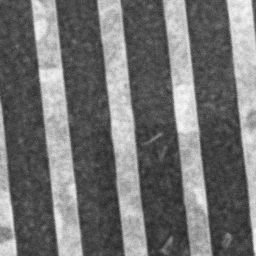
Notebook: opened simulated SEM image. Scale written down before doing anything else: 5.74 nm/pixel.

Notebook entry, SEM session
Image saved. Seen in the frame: one or a few lines or trenches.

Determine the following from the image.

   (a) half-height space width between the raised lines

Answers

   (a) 256 nm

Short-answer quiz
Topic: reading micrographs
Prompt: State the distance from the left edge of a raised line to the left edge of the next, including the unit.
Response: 65 pixels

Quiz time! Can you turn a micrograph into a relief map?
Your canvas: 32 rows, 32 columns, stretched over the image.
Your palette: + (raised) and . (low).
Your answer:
....+++.....+++......++......++.
....+++.....+++......++......++.
....+++......++......++......+++
....+++......++......++......+++
.....++......++......++......+++
.....++......++......+++.....+++
.....++......+++.....+++.....+++
.....+++.....+++.....+++.....+++
.....+++.....+++.....+++.....+++
.....+++.....+++......++.....+++
.....+++.....+++......++......++
.....+++......++......++......++
.....+++......++......++......++
.....+++......++......++......++
......++......++......+++.....++
......++......+++.....+++.....++
......+++.....+++.....+++.....++
+.....+++.....+++.....+++.....++
+.....+++.....+++......++......+
+.....+++.....+++......++......+
+.....+++.....+++......++......+
+.....+++......++......++......+
+.....+++......++......++......+
+......++......++......++......+
+......++......++......+++.....+
+......+++.....+++.....+++.....+
+......+++.....+++.....+++.....+
+......+++.....+++.....+++......
++.....+++.....+++......++......
++.....+++.....+++......++......
++.....+++......++......++......
++.....+++......++......++......